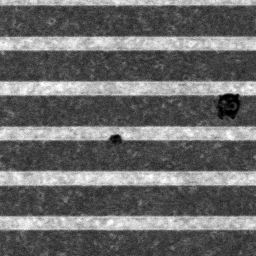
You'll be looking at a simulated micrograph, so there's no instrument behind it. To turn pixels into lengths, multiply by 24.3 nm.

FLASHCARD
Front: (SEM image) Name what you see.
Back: parallel lines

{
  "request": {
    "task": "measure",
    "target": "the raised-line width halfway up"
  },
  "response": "814 nm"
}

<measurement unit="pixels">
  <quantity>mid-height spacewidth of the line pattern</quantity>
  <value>11.5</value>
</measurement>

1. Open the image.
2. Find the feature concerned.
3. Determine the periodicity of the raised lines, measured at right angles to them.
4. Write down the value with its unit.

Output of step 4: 1080 nm